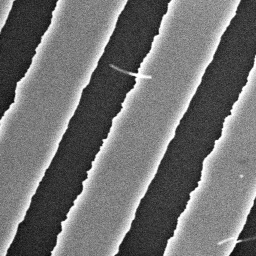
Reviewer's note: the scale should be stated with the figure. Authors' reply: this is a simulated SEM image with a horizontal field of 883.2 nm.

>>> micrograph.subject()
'lines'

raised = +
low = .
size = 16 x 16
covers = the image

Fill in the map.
+..+++++...++++.
...++++...++++..
...++++...++++..
..++++...++++...
..++++...++++...
.++++...++++...+
.++++...++++...+
++++...++++...++
++++...++++...++
+++...++++...+++
+++...++++...+++
++...++++...++++
++...++++...++++
++..++++...++++.
+...++++...++++.
+..++++...+++++.